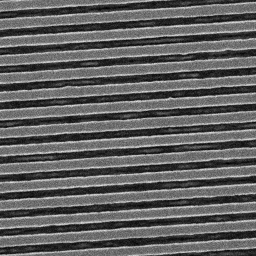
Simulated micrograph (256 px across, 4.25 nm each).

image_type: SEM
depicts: parallel lines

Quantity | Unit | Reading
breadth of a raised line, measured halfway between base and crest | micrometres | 0.0402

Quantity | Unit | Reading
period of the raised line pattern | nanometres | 76.8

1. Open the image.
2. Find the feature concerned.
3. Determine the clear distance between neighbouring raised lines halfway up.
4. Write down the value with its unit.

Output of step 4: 36.5 nanometres